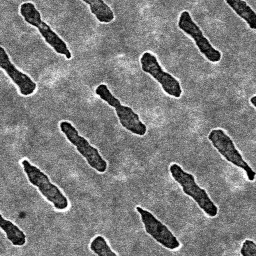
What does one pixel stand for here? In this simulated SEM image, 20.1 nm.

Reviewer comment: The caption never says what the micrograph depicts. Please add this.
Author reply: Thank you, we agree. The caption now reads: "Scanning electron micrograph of a regular array of holes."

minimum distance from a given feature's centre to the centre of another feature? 53.4 pixels